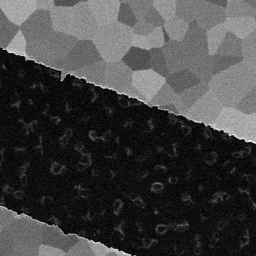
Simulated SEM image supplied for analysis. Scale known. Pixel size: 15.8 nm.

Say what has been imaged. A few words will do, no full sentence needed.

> one or a few lines or trenches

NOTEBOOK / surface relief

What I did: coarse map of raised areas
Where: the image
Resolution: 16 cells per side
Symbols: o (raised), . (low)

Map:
oooooooooooooooo
oooooooooooooooo
oooooooooooooooo
.ooooooooooooooo
....oooooooooooo
.......ooooooooo
.........ooooooo
............oooo
...............o
................
................
................
................
oo..............
oooo............
ooooooo.........